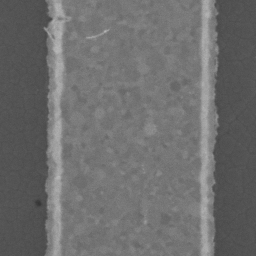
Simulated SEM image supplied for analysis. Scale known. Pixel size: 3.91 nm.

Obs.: one or a few lines or trenches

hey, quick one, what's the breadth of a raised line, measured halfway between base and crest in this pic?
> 579 nm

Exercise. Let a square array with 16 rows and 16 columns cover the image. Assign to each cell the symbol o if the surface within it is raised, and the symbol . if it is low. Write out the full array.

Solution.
....ooooooooo...
....ooooooooo...
....ooooooooo...
....ooooooooo...
....ooooooooo...
....ooooooooo...
....ooooooooo...
....ooooooooo...
....ooooooooo...
....ooooooooo...
....ooooooooo...
....ooooooooo...
....ooooooooo...
...oooooooooo...
....ooooooooo...
....ooooooooo...